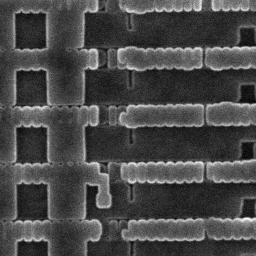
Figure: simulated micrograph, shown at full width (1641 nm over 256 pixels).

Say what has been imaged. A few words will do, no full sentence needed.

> wiring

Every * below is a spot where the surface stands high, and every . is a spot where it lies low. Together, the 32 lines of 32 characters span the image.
************...**********..*****
************....***.............
**....****......................
**....****......................
**....****......................
**....****......................
************...*****************
************...*****************
************...**********.*****.
**....*****.....................
**....*****.....................
**....*****.....................
**....****......................
************....****************
************...*****************
************...**********.******
**....*****.....................
**....*****.....................
**....*****.....................
**....*****.....................
**.*********....*********.******
*************..*****************
**************..*********.******
**....*****.**..................
**....*****.**..................
**....*****.**..................
**....*****.....................
**....*****.......**************
*************...****************
*************..*****************
**....*****.....................
**....*****.....................